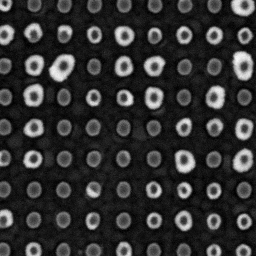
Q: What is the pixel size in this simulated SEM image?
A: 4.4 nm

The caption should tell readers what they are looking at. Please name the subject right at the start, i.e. a regular array of raised bodies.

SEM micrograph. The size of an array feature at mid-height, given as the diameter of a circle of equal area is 66.4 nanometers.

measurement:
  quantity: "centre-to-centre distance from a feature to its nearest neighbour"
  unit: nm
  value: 131